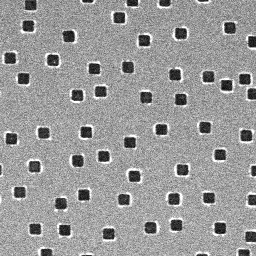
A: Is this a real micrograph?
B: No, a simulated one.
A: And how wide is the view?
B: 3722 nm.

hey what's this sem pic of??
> a regular array of holes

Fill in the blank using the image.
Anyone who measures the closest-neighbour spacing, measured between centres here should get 425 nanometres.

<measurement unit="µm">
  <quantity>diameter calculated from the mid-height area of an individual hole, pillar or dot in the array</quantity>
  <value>0.193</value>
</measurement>